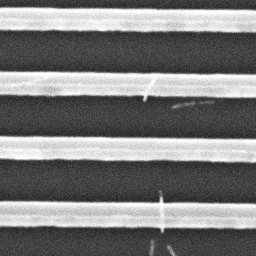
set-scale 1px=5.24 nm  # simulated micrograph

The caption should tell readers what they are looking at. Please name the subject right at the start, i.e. lines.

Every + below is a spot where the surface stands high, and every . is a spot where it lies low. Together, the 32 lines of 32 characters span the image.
................................
++++++++++++++++++++++++++++++++
++++++++++++++++++++++++++++++++
++++++++++++++++++++++++++++++++
................................
................................
................................
................................
................................
++++++++++++++++++++++++++++++++
++++++++++++++++++++++++++++++++
++++++++++++++++++++++++++++++++
................................
................................
................................
................................
................................
++++++++++++++++++++............
++++++++++++++++++++++++++++++++
++++++++++++++++++++++++++++++++
................................
................................
................................
................................
................................
++++++++++++++++++..+...........
++++++++++++++++++++++++++++++++
++++++++++++++++++++++++++++++++
....................+...........
................................
................................
................................